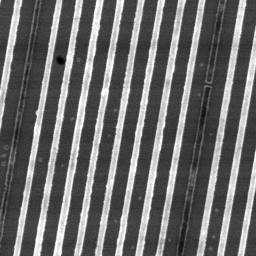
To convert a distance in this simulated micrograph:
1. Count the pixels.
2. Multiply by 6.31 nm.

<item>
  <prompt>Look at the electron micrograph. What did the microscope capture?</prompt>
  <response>parallel lines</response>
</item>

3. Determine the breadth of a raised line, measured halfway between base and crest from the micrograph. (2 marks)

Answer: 35.7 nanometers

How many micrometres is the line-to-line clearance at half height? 0.0887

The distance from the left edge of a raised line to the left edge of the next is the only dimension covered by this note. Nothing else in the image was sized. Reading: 127 nm